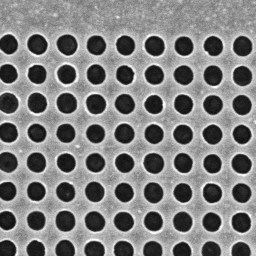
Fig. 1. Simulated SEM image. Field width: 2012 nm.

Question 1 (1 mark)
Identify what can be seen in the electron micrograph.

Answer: a regular array of holes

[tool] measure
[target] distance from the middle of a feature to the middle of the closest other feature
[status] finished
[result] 29 px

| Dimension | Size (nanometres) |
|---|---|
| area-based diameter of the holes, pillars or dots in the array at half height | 155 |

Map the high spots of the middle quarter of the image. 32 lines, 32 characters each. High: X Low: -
--XXXXX--XXXXX--XXXXX--XXXXXX--X
---XXX----XXX----XXX-----XXX----
---XXX-----XX-----XX-----XX-----
---XXX----XXX-----XX-----XXX----
--XXXX----XXXX---XXXX---XXXX----
XXXXXXXXXXXXXXXXXXXXXXXXXXXXXXXX
XXXXXXXXXXXXXXXXXXXXXXXXXXXXXXXX
--XXXXX-XXXXXXX-XXXXXXXXXXXXXXXX
---XXX----XXX----XXXX---XXXX----
---XX-----XXX-----XX-----XXX----
---XXX----XXX-----XX-----XXX----
---XXX----XXX----XXXX---XXXX----
-XXXXXX--XXXXXX-XXXXXX-XXXXXX--X
XXXXXXXXXXXXXXXXXXXXXXXXXXXXXXXX
XXXXXXXXXXXXXXXXXXXXXXXXXXXXXXXX
--XXXXX--XXXXX---XXXX---XXXX---X
---XXX----XXX----XXX-----XX-----
---XX-----XXX-----XX-----XX-----
---XXX----XXX----XXX-----XX-----
--XXXXX--XXXXX---XXXX---XXXX----
XXXXXXXXXXXXXXXXXXXXXXXXXXXXXXXX
XXXXXXXXXXXXXXXXXXXXXXXXXXXXXXXX
--XXXXX--XXXXX--XXXXX--XXXXX---X
---XXX----XXX----XXX-----XXX----
---XX-----XXX-----XX-----XX-----
---XXX----XXX-----XX-----XXX----
--XXXX---XXXX----XXX-----XXX----
XXXXXXXXXXXXXXXXXXXXXXXXXXXXXXXX
XXXXXXXXXXXXXXXXXXXXXXXXXXXXXXXX
-XXXXX--XXXXXXXXXXXXXXXXXXXXXXXX
--XXX-----XXX----XXX----XXXX---X
---XX-----XXX----XXX-----XX-----